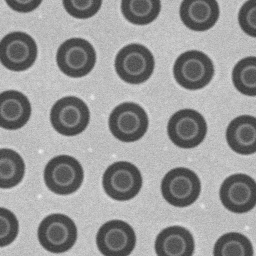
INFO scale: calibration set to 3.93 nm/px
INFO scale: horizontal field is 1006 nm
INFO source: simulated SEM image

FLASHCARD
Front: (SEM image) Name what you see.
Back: an array of small figures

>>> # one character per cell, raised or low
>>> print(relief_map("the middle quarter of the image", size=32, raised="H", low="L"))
LHHHHLLLHHHHLLLHHHHHLLLHHHHLLLHH
LLLLLLLHHHHHHLLHHHHHLLLHHHHLLLHH
LLLLLLHHHHHHHLLLLHLLLLHHHHHLLLHH
HHLLLHHHHHHHHHLLLLLLLLHHHHHLLLHH
HHHHHHHHHHHHHHHLLLLLLHHHHHHHLLLL
HHHHHHHHHHHHHHHHLLLLHHHHHHHHHLLL
HHHHHHHHHHHHHHHHHHHHHHHHHHHHHHHL
HHHHHHHHHHHHHHHHHHHHHHHHHHHHHHHH
LLLLHHHHHHHHHHHHHHHHHHHHHHHHHHHH
LLLLLLHHHHHHHHLLLLHHHHHHHHHHHHHH
LLLLLLHHHHHHHLLLLLLLHHHHHHHHHHHH
HHHLLLLHHHHHLLLLLLLLHHHHHHHHHLLL
HHHHLLLHHHHLLLLHHLLLLHHHHHHLLLLL
HHHHLLLHHHHLLLHHHHLLLHHHHHLLLLLL
HHHHLLHHHHHLLHHHHHHLLHHHHHLLLHHH
LHLLLLHHHHHLLLHHHHHLLHHHHHLLHHHH
LLLLLHHHHHHLLLHHHHLLLHHHHHLLHHHH
LLLLHHHHHHHHLLLLLLLLHHHHHHLLHHHH
HHHHHHHHHHHHHLLLLLLHHHHHHHLLLHHH
HHHHHHHHHHHHHHHLLHHHHHHHHHHLLLLL
HHHHHHHHHHHHHHHHHHHHHHHHHHHHLLLL
HHHHHHHHHHHHHHHHHHHHHHHHHHHHHHHH
HHHHHHHHHHHHHHHHHHHHHHHHHHHHHHHH
LLLHHHHHHHHHHHHHHHHHHHHHHHHHHHHH
LLLLHHHHHHHHHLLLHHHHHHHHHHHHHHHH
HLLLLHHHHHHLLLLLLLHHHHHHHHHHHHHH
HHLLLHHHHHLLLLLLLLLHHHHHHHLLLLLL
HHLLLHHHHHLLLHHHLLLHHHHHHLLLLLLL
HHLLLHHHHLLLHHHHHLLLHHHHHLLLHHLL
HHLLLHHHHLLLHHHHHLLLHHHHLLLHHHHL
LLLLLHHHHLLLHHHHHLLLHHHHLLLHHHHH
LLLLHHHHHHLLLLHHLLLHHHHHLLHHHHHH